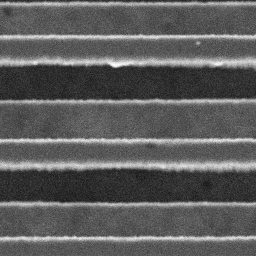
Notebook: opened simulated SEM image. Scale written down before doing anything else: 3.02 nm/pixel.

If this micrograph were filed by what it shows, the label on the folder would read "lines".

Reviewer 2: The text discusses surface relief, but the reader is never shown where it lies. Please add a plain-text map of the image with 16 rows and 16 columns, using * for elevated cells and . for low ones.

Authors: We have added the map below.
****************
****************
****************
****************
................
................
****************
****************
****************
****************
................
................
................
****************
****************
****************